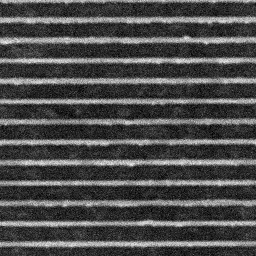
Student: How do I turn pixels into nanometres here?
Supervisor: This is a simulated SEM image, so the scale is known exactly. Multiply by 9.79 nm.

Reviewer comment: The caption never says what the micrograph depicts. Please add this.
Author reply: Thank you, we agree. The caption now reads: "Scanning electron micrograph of parallel lines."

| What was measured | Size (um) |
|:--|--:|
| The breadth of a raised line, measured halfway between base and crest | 0.0428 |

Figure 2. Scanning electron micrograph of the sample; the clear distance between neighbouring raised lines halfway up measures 0.154 micrometres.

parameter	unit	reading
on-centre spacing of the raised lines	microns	0.199